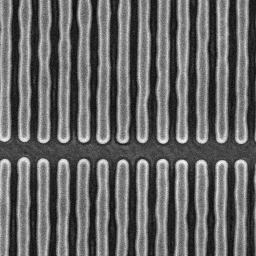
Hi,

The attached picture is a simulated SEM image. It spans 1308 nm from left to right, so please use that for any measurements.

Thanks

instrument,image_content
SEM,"groups of lines, slits or small figures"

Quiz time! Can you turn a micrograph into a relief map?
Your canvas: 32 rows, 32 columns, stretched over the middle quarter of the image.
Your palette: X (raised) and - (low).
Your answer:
X---XX---XX---XX---XX--XXX---XX-
X---XX---XX---XX---XX---XX---XX-
X---XX---XX---XX---XX---XX---XX-
X---XX---XX---XX---XX---XX--XXX-
X---XX---XX---XX---XX---XX--XXX-
X---XX---XX---XX---XX--XXX--XXX-
X---XX---XX---XX---XX--XXX--XXX-
X---XX--XXX---XX---XX--XXX--XXX-
X---XX--XXX---XX---XX---XX---X--
X---XX--XXX---XX---XX---XX---X--
X---XX---XX---XX---XX---XX---XX-
X---XX---XX---XX--XXX---XX---XX-
X---XX---XX---XX--XXX---XX--XXX-
X---XX---XX---XX--XXX---XX--XX--
X---XX---XX---XX---XX---XX--XX--
X---XX---XX---XX---XX---XX--XXX-
X---XX---XX---XX---XX---XX--XXX-
X---XX--XXX---XX---XX---XX--XXX-
X---XX--XXX---XX---XX---XX--XXX-
--------------------------------
--------------------------------
--------------------------------
--------------------------------
--------------------------------
X---XX---X----XX---X----X----X--
X---XX---XX---XX---XX---XX--XXX-
X---XX---XX--XXX---XX---XX--XXX-
X---XX---XX--XXX---XX---XX--XX--
X---XX---XX--XXX--XXX---XX--XX--
X--XXX---XX--XXX--XXX---XX--XXX-
X--XXX---XX--XXX---XX---XX--XXX-
X--XXX---XX--XXX---XX---XX--XXX-